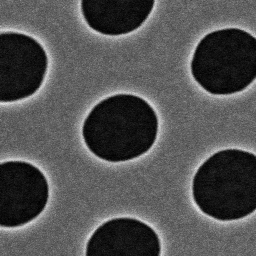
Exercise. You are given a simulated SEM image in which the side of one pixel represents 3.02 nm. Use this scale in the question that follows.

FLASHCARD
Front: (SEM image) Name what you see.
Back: holes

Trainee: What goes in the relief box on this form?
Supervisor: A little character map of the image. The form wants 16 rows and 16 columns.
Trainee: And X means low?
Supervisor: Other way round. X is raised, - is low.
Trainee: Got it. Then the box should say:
XXXXX-----XXXXXX
XXXXXX---XXXXXXX
--XXXXXXXXXXX---
---XXXXXXXXX----
---XXXXXXXXX----
--XXXXXXXXXXX--X
XXXXXX---XXXXXXX
XXXXX-----XXXXXX
XXXXX-----XXXXXX
XXXXXX---XXXXX-X
--XXXXXXXXXX----
---XXXXXXXXX----
---XXXXXXXXX----
--XXXXXXXXXXX--X
XXXXXX----XXXXXX
XXXXX-----XXXXXX